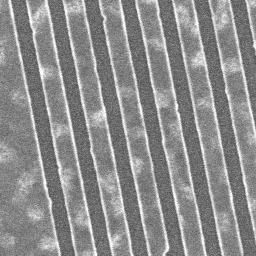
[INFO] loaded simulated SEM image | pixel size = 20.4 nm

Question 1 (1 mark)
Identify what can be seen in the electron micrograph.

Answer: parallel lines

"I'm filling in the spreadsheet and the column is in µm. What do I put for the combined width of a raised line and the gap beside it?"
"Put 0.734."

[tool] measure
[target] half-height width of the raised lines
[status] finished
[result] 0.413 micrometres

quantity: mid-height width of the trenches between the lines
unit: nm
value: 323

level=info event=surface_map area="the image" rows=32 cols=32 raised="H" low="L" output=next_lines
HLLHHHLLHHLLHHHLLHHHLLHHLLHHHLLH
HHLLHHLLHHHLLHHLLHHHLLHHLLHHHLLH
HHLLHHLLHHHLLHHLLHHHLLHHHLLHHLLH
HHLLHHLLLHHLLHHHLLHHLLHHHLLHHLLH
HHLLHHHLLHHLLHHHLLHHLLHHHLLHHHLL
HHLLHHHLLHHLLHHHLLHHHLLHHLLHHHLL
HHLLHHHLLHHHLLHHLLHHHLLHHLLHHHLL
HHHLLHHLLHHHLLHHLLHHHLLHHHLLHHLL
HHHLLHHLLHHHLLHHHLLHHLLHHHLLHHLL
HHHLLHHHLLHHLLHHHLLHHLLHHHLLHHHL
HHHLLHHHLLHHLLHHHLLHHHLLHHLLHHHL
HHHLLHHHLLHHHLLHHLLHHHLLHHHLHHHL
HHHHLLHHLLHHHLLHHLLHHHLLHHHLLHHL
HHHHLLHHLLHHHLLHHHLLHHLLHHHLLHHL
HHHHLLHHHLLHHLLHHHLLHHLLHHHLLHHH
HHHHLLHHHLLHHLLHHHLLHHHLLHHLLHHH
HHHHLLHHHLLHHHLLHHLLHHHLLHHLLHHH
HHHHHLLHHLLHHHLLHHLLHHHLLHHHLLHH
HHHHHLLHHLLHHHLLHHHLHHHLLHHHLLHH
HHHHHLLHHHLLHHLLHHHLLHHLLHHHLLHH
HHHHHLLHHHLLHHLLHHHLLHHHLLHHLLHH
HHHHHLLHHHLLHHHLLHHLLHHHLLHHLLHH
HHHHHHLLHHLLHHHLLHHLLHHHLLHHHLHH
HHHHHHLLHHLLHHHLLHHHLLHHLLHHHLLH
HHHHHHLLHHHLLHHLLHHHLLHHLLHHHLLH
HHHHHHLLHHHLLHHLLHHHLLHHHLHHHLLH
HHHHHHLLHHHLLHHHLLHHLLHHHLLHHLLH
HHHHHHHLLHHLLHHHLLHHLLHHHLLHHHLH
HHHHHHHLLHHLLHHHLLHHHLLHHLLHHHLL
HHHHHHHLLHHHLLHHLLHHHLLHHLLHHHLL
HHHHHHHLLHHHLLHHLLHHHLLHHHLLHHLL
HHHHHHHLLHHHLLHHLLLHHLLHHHLLHHLL